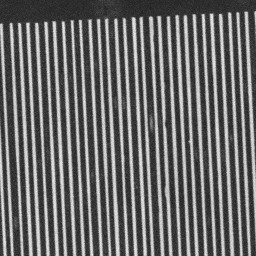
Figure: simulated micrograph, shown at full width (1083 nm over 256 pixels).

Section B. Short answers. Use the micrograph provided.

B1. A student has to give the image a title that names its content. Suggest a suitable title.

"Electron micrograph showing parallel lines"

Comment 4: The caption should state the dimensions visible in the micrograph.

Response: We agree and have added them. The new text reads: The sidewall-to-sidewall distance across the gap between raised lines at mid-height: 0.0233 um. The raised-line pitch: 37 nanometres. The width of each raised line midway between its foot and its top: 11.6 nm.